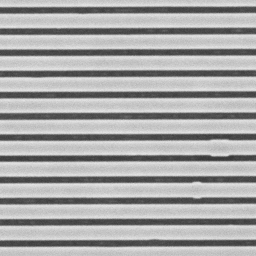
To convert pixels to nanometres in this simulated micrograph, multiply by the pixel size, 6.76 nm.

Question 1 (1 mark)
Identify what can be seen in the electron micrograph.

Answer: parallel lines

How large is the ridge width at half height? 14 pixels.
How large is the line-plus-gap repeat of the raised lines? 143 nanometres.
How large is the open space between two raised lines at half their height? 49.8 nanometres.